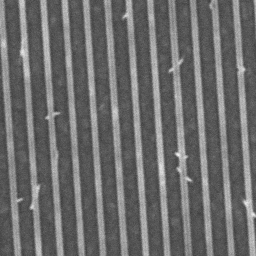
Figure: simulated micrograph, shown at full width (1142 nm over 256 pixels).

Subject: parallel lines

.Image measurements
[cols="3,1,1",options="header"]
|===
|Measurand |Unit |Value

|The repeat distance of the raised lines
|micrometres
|0.0952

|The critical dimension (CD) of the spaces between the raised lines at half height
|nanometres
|69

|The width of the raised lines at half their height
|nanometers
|26.1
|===